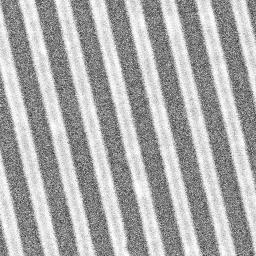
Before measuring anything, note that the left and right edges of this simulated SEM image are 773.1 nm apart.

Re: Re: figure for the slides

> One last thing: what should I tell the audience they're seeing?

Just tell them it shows parallel lines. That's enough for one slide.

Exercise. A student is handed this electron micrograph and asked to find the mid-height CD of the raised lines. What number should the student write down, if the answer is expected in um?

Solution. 0.0408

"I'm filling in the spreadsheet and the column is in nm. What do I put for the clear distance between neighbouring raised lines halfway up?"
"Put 63.6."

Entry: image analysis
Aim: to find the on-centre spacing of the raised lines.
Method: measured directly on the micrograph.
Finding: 0.104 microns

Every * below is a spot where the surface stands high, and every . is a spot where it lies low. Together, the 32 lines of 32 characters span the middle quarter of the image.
..***......*.*.....****.....***.
..***......***.....****.....****
..****.....***......***......***
..****.....***......****.....***
...***......***.....****.....***
...***......***.....****.....***
...****.....***......***......**
...****.....***......***......**
....***......***.....****.....**
....***......***.....****.....**
....***......***......***......*
....****.....***......***......*
.....***.....****.....****.....*
.....***......***.....****.....*
.....***......***......***.....*
.....****.....***......***......
......***.....****.....***......
......***......***.....****.....
*.....***......***......***.....
*.....****.....***......***.....
*.....****.....****.....***.....
*......***......***.....****....
*......***......***.....****....
**.....****.....***......***....
**.....****.....***......***....
**......***......***.....****...
**......***......***.....****...
***.....****.....***......***...
***.....****.....***......***...
***......***.....****.....****..
***......***......***.....****..
****.....***......***......***..